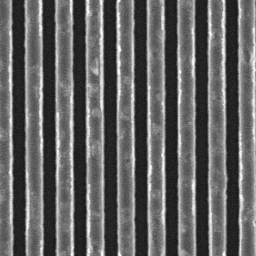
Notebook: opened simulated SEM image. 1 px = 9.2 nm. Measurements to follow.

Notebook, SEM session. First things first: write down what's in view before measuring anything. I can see parallel lines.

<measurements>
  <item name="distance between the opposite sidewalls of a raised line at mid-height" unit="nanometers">151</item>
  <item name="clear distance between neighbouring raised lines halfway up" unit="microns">0.125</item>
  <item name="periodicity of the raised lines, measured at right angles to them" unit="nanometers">280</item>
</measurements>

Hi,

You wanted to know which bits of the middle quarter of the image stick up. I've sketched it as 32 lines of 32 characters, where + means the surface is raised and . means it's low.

++....++++....+++....++++....+++
++....++++...++++....++++....+++
++....++++....+++....++++....+++
++....++++....+++....++++....+++
++....++++....+++....++++....+++
++....++++....+++....++++....+++
++....++++....+++....++++....+++
++....++++....+++....++++....+++
++....++++....+++....++++....+++
++....++++....+++....++++....+++
++....++++...++++....++++....+++
++....++++...++++....++++....+++
++....++++...++++....++++....+++
++....++++...++++....++++....+++
++....++++...++++....++++....+++
++....++++....+++....++++....+++
++....++++....+++....++++....+++
++....++++....+++....++++....+++
++....++++....+++....++++....+++
++....++++....+++....++++....+++
++....++++...++++....++++....+++
++....++++...++++....++++....+++
++....++++....+++....++++....+++
++....++++....+++....++++....+++
++....++++....+++....++++....+++
++....++++...++++....++++....+++
++....++++...++++....++++....+++
++....++++...++++....++++....+++
++....++++....+++....++++....+++
++....++++....+++....++++....+++
++....++++....+++....++++....+++
++....++++....+++....++++....+++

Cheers